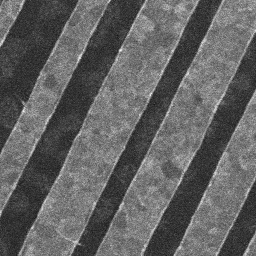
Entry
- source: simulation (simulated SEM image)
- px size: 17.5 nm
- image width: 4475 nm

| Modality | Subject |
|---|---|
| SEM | one or a few lines or trenches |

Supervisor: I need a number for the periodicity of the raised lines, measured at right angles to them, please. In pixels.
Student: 68.4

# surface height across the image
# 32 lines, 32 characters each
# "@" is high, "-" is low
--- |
@@@-------@@@-----@@@@@@@---@@@@
@@-------@@@@----@@@@@@@---@@@@@
@@-------@@@-----@@@@@@----@@@@@
@-------@@@@----@@@@@@@---@@@@@@
@-------@@@-----@@@@@@@---@@@@@@
-------@@@@----@@@@@@@---@@@@@@-
-------@@@-----@@@@@@@---@@@@@@-
------@@@@----@@@@@@@---@@@@@@--
-----@@@@-----@@@@@@@---@@@@@@--
-----@@@@----@@@@@@@---@@@@@@---
-----@@@-----@@@@@@@---@@@@@@---
----@@@@----@@@@@@@---@@@@@@----
----@@@-----@@@@@@@---@@@@@@---@
@--@@@@----@@@@@@@---@@@@@@----@
---@@@-----@@@@@@@---@@@@@@---@@
--@@@@----@@@@@@@---@@@@@@----@@
--@@@-----@@@@@@----@@@@@@---@@@
-@@@@----@@@@@@@---@@@@@@----@@@
@@@@-----@@@@@@@---@@@@@@---@@@@
@@@@----@@@@@@@---@@@@@@----@@@@
@@@-----@@@@@@----@@@@@@---@@@@@
@@@-----@@@@@@---@@@@@@----@@@@@
@@-----@@@@@@----@@@@@@---@@@@@@
@@----@@@@@@@---@@@@@@----@@@@@-
@-----@@@@@@----@@@@@@---@@@@@@-
@----@@@@@@@---@@@@@@----@@@@@--
-----@@@@@@----@@@@@----@@@@@@--
-----@@@@@@---@@@@@@----@@@@@---
----@@@@@@@---@@@@@-----@@@@@---
---@@@@@@@---@@@@@@----@@@@@----
---@@@@@@@---@@@@@-----@@@@@---@
---@@@@@@---@@@@@@----@@@@@----@